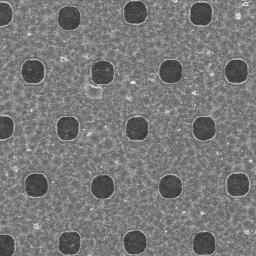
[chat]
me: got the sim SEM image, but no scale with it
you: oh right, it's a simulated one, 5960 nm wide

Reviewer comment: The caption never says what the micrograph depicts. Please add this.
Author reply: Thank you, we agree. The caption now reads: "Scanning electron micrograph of a regular array of holes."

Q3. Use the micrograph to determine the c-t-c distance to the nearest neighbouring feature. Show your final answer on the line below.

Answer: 1520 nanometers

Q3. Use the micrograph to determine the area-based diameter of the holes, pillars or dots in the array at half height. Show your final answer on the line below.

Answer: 566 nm